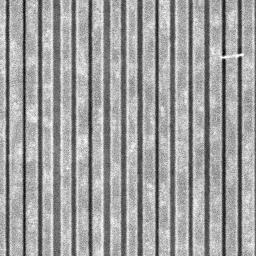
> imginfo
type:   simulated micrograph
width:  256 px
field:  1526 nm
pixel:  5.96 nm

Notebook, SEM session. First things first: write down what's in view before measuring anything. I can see parallel lines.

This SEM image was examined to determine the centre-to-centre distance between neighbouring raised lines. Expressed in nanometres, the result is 98.9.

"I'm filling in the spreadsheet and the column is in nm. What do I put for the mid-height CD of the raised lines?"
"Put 67.1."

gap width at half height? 31.3 nanometres